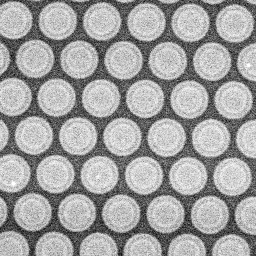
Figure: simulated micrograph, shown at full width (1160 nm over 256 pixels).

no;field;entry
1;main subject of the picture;an array of small figures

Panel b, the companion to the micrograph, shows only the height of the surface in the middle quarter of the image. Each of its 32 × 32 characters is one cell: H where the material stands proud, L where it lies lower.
HHHHHHHHLLHHHHHHHHHLLHHHHHHHHHLL
HHHHHHHHLLLHHHHHHHHLLLHHHHHHHHLL
LHHHHHHLLLLLHHHHHHLLLLLHHHHHHLLL
LLLLLLLLLLLLLHHHLLLLLLLLHHHHLLLL
HLLLLLLHHHHLLLLLLLHHHHLLLLLLLLHH
HHLLLLHHHHHHHLLLLHHHHHHHLLLLHHHH
HHLLLHHHHHHHHLLLHHHHHHHHLLLHHHHH
HHHLLHHHHHHHHHLLHHHHHHHHHLLHHHHH
HHHLLHHHHHHHHHLLHHHHHHHHHLLHHHHH
HHHLLHHHHHHHHHLLHHHHHHHHHLLHHHHH
HHLLLHHHHHHHHLLLHHHHHHHHHLLHHHHH
HHLLLLHHHHHHHLLLHHHHHHHHLLLHHHHH
LLLLLLLHHHHHLLLLLLHHHHHLLLLLHHHH
LLLHLLLLLLLLLLLLLLLLLLLLLLLLLLHH
HHHHHHHLLLLLHHHHHLLLLLLHHHHHLLLL
HHHHHHHLLLLHHHHHHHLLLLHHHHHHHLLL
HHHHHHHHLLHHHHHHHHHLLHHHHHHHHHLL
HHHHHHHHLLHHHHHHHHHLLHHHHHHHHHLL
HHHHHHHHLLHHHHHHHHHLLHHHHHHHHHLL
HHHHHHHHLLHHHHHHHHHLLHHHHHHHHHLL
HHHHHHHLLLLHHHHHHHHLLHHHHHHHHHLL
HHHHHHHLLLLHHHHHHHLLLLHHHHHHHLLL
LLHHHLLLLLLLLHHHLLLLLLLHHHHHLLLL
LLLLLLLHHHHLLLLLLLHHHHLLLLLLLLHL
HLLLLLHHHHHHLLLLLHHHHHHLLLLLHHHH
HHLLLHHHHHHHHLLLHHHHHHHHLLLHHHHH
HHLLHHHHHHHHHLLLHHHHHHHHLLLHHHHH
HHLLHHHHHHHHHHLHHHHHHHHHHLHHHHHH
HHLLHHHHHHHHHLLHHHHHHHHHHLHHHHHH
HHLLLHHHHHHHHLLLHHHHHHHHLLLHHHHH
HLLLLHHHHHHHHLLLHHHHHHHHLLLHHHHH
LLLLLLHHHHHHLLLLLHHHHHHLLLLLHHHH